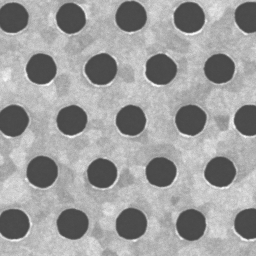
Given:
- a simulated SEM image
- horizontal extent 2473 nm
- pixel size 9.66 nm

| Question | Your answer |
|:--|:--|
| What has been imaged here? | a regular array of holes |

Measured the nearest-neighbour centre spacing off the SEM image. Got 58.9 pixels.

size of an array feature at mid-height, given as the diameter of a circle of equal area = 0.302 micrometres